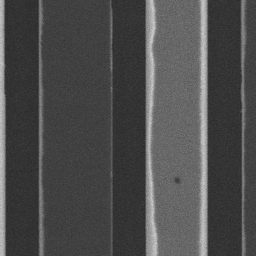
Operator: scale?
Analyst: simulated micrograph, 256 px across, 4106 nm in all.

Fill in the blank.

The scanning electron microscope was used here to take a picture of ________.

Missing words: lines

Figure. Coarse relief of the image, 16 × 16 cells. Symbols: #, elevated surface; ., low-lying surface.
..#####..####..#
..#####..####..#
..#####..####..#
..#####..####..#
..#####..####..#
..#####..####..#
..#####..####..#
..#####..####..#
..#####..####..#
..#####..####..#
..#####..####..#
..#####..####..#
..#####..####..#
..#####..####..#
...####..####..#
...####..####..#